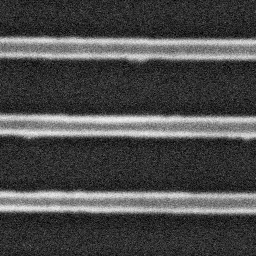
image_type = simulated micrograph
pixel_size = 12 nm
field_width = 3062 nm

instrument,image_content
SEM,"lines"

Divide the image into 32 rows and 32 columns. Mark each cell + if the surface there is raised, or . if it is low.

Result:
................................
................................
................................
................................
................................
++++++++++++++++++++++++++++++++
++++++++++++++++++++++++++++++++
................................
................................
................................
................................
................................
................................
................................
................................
++++++++++++++++++++++++++++++++
++++++++++++++++++++++++++++++++
................................
................................
................................
................................
................................
................................
................................
++++++++++++++++++++++++++++++++
++++++++++++++++++++++++++++++++
...............................+
................................
................................
................................
................................
................................